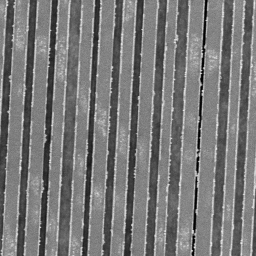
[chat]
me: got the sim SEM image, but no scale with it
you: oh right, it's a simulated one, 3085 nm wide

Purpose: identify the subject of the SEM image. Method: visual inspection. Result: parallel lines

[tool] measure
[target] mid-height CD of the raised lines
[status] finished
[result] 172 nm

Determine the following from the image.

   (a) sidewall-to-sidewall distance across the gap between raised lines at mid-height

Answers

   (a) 91.8 nm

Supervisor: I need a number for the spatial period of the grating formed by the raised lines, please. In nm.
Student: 261